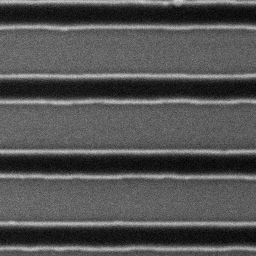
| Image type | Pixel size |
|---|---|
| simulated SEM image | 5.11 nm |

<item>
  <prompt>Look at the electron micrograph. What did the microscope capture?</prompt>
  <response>lines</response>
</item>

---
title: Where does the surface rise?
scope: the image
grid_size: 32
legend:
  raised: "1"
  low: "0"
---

11111111111111111111111111111111
11111111111111111111111111111111
11111111111111111111111111111111
00000011110000000000000000000001
00000000000000000000000000000000
00000000000000000000000000000000
00000000000000000000000000000000
00000000000000000000000000000000
00000000000000000000000000000000
11111111111111111111111111111111
11111111111111111111111111111111
11111111111111111111111111111111
11111111111111111111111111111111
00000000000000000000000000000000
00000000000000000000000000000000
00000000000000000000000000000000
00000000000000000000000000000000
00000000000000000000000000000000
00000000000000000000000000000000
11111111111111111111111111111111
11111111111111111111111111111111
11111111111111111111111111111111
00000000000000000000000000000000
00000000000000000000000000000000
00000000000000000000000000000000
00000000000000000000000000000000
00000000000000000000000000000000
00000000000000000000000000000000
11111111111111111111111111111111
11111111111111111111111111111111
11111111111111111111111111111111
00000000000000000000000000000000